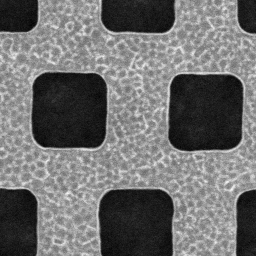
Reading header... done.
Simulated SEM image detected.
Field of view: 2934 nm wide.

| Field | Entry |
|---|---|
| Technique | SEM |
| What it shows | holes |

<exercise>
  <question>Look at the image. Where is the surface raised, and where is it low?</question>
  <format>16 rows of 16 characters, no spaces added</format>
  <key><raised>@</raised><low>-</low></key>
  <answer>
--@@@@-----@@@@-
--@@@@-----@@@@-
@@@@@@@@@@@@@@@@
@@@@@@@@@@@@@@@@
@@@--@@@@@@@@@@@
@@-----@@@@----@
@@-----@@@@----@
@@-----@@@-----@
@@-----@@@@----@
@@@@@@@@@@@@@@@@
@@@@@@@@@@@@@@@@
@@@@@@@@@@@@@@@@
--@@@@-----@@@@-
--@@@@-----@@@@-
--@@@@-----@@@@-
--@@@@-----@@@@-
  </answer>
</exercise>